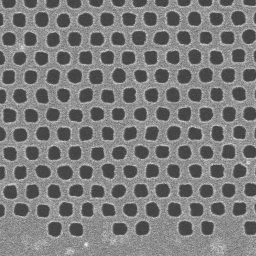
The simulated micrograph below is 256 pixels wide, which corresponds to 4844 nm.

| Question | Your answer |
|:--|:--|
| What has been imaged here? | a regular array of holes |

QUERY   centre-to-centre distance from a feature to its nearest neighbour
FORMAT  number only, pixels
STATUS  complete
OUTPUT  21.3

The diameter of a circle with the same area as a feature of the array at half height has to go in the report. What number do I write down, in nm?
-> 267